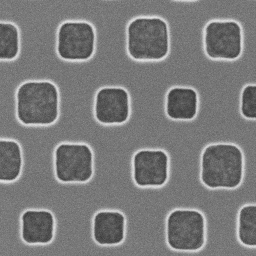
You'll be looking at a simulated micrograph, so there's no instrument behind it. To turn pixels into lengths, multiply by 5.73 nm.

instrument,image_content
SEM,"a regular array of holes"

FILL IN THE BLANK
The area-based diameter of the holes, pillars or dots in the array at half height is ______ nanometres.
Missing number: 224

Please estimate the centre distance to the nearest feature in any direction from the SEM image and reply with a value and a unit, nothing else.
410 nanometres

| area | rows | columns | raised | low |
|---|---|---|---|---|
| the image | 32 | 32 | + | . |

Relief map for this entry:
++++++++++++++++++++++++++++++++
++++++++++++++++++++++++++++++++
+++++++++++++++++...++++++++++++
..++++++...+++++.....+++++....++
..+++++.....++++.....+++++....++
..+++++.....++++.....+++++....++
..+++++.....++++.....+++++....++
++++++++++++++++++++++++++++++++
++++++++++++++++++++++++++++++++
++++++++++++++++++++++++++++++++
+++...++++++++++++++++++++++++++
++.....+++++....+++++...++++++..
++.....+++++....+++++....+++++..
++.....+++++....+++++....+++++..
++.....+++++....+++++...+++++++.
++++.+++++++++++++++++++++++++++
++++++++++++++++++++++++++++++++
.+++++++++++++++++++++++++++++++
..+++++....+++++++++++++++....++
...++++....++++++....++++.....++
...++++....++++++....++++.....++
..+++++....++++++....++++.....++
.+++++++...++++++....++++.....++
++++++++++++++++++++++++++++++++
++++++++++++++++++++++++++++++++
++++++++++++++++++++++++++++++++
+++...++++++++++++++++...+++++..
+++....+++++...++++++....+++++..
+++....+++++....+++++.....++++..
+++....+++++...++++++.....++++..
+++++++++++++.+++++++....++++++.
++++++++++++++++++++++++++++++++